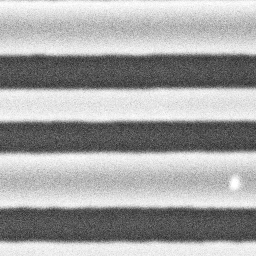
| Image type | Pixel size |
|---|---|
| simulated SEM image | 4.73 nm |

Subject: lines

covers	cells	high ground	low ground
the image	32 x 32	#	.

################################
################################
################################
################################
################################
################################
################################
................................
................................
................................
................................
################################
################################
################################
################################
................................
................................
................................
................................
.##....#########################
################################
################################
################################
################################
################################
################################
................................
................................
................................
................................
################################
################################